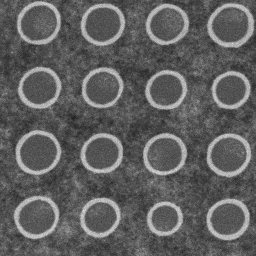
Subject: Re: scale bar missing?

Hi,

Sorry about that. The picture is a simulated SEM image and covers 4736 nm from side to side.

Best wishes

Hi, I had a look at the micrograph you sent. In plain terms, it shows a regular array of raised bodies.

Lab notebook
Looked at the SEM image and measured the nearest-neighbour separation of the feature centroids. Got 1180 nm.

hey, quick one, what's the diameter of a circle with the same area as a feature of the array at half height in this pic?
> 38.7 pixels